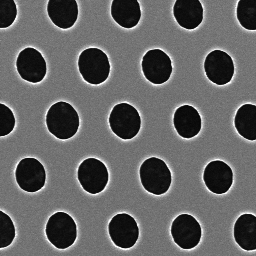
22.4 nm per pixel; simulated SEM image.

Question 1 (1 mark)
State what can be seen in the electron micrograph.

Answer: a regular array of holes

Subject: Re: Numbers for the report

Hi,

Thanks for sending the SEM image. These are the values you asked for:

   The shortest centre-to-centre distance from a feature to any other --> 1.4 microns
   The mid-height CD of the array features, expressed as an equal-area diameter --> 32.8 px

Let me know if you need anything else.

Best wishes